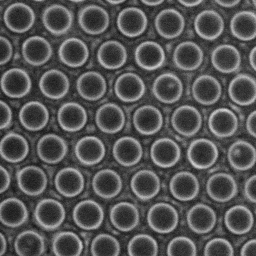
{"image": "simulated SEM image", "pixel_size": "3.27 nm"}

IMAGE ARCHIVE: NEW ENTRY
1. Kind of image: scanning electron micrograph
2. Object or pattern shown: a regular array of raised bodies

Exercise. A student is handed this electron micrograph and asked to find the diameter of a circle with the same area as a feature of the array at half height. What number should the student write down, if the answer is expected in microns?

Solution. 0.0936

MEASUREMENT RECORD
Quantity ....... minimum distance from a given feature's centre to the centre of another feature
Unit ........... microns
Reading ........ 0.121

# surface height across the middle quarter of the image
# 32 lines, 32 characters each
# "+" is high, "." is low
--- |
..........++++.....+++++....++++
................................
.....++++......+++..............
+...++++++....+++++....+++++....
+..+++++++.+.+++++++...++++++...
+..+++++++...+++++++..++++++++..
+..+++++++...+++++++..++++++++..
....++++++...+++++++...++++++...
.....++++.....+++++....++++++...
.........................++.....
++++......+++.......+...........
+++++....+++++.++.+++++..+..++++
+++++...+++++++...++++++...+++++
+++++...+++++++...++++++...+++++
+++++...+++++++...++++++...+++++
+++++.+..++++++.+.++++++...+++++
.++...+..+++++....+++++.....++++
.............................+++
.....+++......++............+...
....+++++....+++++.....+++++....
...+++++++...++++++...++++++....
...+++++++..+++++++...+++++++..+
...+++++++..+++++++...+++++++..+
....++++++...++++++...+++++++..+
.....+++......++++.....+++++....
........................+++.....
+++.............................
++++....+++++.....+++++.....++++
+++++..+++++++...+++++++...+++++
+++++..+++++++...+++++++...+++++
+++++..+++++++...+++++++...+++++
+++++...++++++...+++++++...+++++